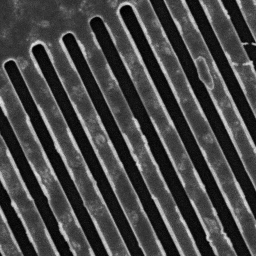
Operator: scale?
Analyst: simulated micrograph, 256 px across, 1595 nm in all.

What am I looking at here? parallel lines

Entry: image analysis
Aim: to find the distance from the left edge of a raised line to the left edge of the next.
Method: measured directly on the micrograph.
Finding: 32.1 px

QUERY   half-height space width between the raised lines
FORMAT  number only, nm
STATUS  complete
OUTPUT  82.8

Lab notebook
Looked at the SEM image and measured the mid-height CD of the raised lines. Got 118 nm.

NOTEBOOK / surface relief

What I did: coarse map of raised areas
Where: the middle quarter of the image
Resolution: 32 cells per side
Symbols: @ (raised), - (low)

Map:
@@----@@@@@----@@@@@----@@@@@---
@@@----@@@@@----@@@@@---@@@@@@--
@@@----@@@@@----@@@@@----@@@@@--
@@@@----@@@@@----@@@@@----@@@@@-
@@@@----@@@@@----@@@@@----@@@@@-
@@@@@----@@@@@----@@@@@----@@@@@
@@@@@----@@@@@----@@@@@----@@@@@
-@@@@@----@@@@@----@@@@@----@@@@
-@@@@@----@@@@@----@@@@@----@@@@
--@@@@@----@@@@@----@@@@@----@@@
--@@@@@----@@@@@----@@@@@----@@@
---@@@@@----@@@@@----@@@@-----@@
---@@@@@----@@@@@----@@@@@----@@
----@@@@@----@@@@@----@@@@-----@
----@@@@@----@@@@@----@@@@@----@
@----@@@@@----@@@@@----@@@@----@
@----@@@@@----@@@@@----@@@@@----
@@----@@@@@---@@@@@@---@@@@@----
@@----@@@@@----@@@@@----@@@@@---
@@@----@@@@@---@@@@@@---@@@@@---
@@@----@@@@@----@@@@@----@@@@@--
@@@@----@@@@@----@@@@----@@@@@--
@@@@----@@@@@----@@@@@----@@@@@-
@@@@@----@@@@@----@@@@----@@@@@-
@@@@@----@@@@@----@@@@@----@@@@@
@@@@@@----@@@@@---@@@@@@---@@@@@
-@@@@@----@@@@@----@@@@@----@@@@
-@@@@@@----@@@@@---@@@@@----@@@@
--@@@@@----@@@@@----@@@@@----@@@
---@@@@@----@@@@----@@@@@----@@@
---@@@@@----@@@@@----@@@@@----@@
----@@@@-----@@@@----@@@@@----@@